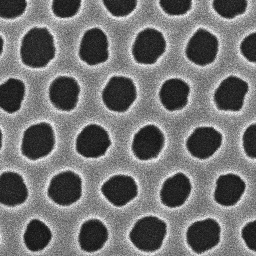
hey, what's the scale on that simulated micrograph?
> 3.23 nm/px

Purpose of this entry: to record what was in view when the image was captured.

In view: a regular array of holes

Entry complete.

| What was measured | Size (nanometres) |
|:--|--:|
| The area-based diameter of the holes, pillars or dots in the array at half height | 107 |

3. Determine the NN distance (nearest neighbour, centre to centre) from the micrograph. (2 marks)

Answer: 172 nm